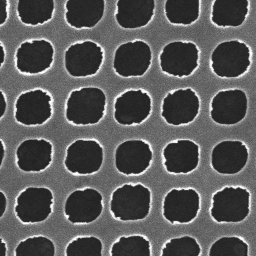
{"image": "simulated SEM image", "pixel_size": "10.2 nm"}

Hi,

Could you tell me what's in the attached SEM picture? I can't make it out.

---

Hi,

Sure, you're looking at a regular array of holes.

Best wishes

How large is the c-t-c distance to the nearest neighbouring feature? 484 nm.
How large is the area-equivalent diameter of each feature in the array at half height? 36.1 pixels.